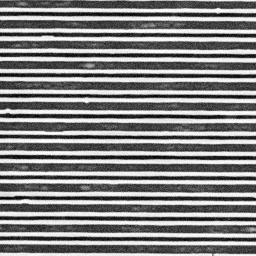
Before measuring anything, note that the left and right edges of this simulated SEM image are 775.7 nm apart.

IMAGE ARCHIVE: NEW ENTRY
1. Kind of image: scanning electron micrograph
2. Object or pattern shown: parallel lines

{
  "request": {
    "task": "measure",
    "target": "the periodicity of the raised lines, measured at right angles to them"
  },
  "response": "30.6 nm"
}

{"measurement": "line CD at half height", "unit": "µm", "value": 0.011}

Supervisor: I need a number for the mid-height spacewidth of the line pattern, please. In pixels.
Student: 8.12